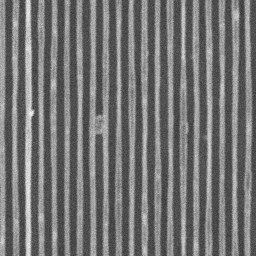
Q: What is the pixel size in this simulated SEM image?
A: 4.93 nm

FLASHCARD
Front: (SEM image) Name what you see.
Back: parallel lines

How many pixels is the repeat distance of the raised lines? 12.9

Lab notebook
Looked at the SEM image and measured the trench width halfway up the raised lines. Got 41.9 nm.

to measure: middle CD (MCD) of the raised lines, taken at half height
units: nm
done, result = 21